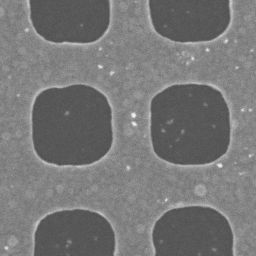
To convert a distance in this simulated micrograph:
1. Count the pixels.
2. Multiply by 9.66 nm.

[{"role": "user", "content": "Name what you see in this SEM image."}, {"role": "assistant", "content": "holes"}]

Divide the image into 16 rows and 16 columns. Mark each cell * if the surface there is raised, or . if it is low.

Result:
**.....**.....**
**.....***....**
***...*****..***
****************
****************
***...****...***
**.....**.....**
**.....**.....**
**.....**.....**
**.....***....**
****************
****************
****************
***...****....**
**.....***....**
**.....***.....*